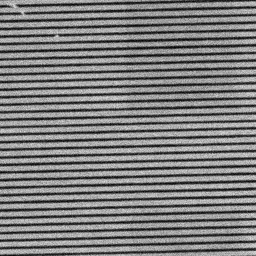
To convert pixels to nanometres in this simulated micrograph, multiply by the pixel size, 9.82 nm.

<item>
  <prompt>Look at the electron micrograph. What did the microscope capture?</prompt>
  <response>parallel lines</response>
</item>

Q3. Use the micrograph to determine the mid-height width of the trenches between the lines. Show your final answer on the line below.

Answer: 0.0282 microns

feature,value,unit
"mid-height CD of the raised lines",45.4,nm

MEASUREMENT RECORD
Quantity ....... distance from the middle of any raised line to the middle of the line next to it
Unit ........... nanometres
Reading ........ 74.2